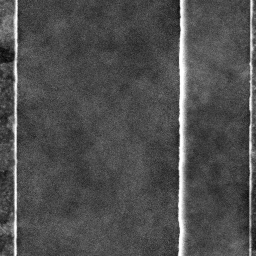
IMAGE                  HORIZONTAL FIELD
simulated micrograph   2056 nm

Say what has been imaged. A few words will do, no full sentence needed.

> lines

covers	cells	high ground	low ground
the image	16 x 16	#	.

#..........#####
#..........#####
#..........#####
#..........#####
#..........#####
#..........#####
#..........#####
#..........#####
#..........#####
#..........#####
#..........#####
#..........#####
#..........#####
#..........#####
#..........#####
#..........#####